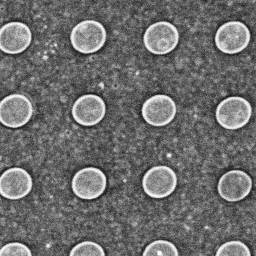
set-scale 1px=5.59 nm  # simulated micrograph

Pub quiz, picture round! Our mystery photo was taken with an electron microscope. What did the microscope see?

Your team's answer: a regular array of raised bodies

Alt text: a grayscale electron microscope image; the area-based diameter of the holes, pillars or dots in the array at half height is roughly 32.1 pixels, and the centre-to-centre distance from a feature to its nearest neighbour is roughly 397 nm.